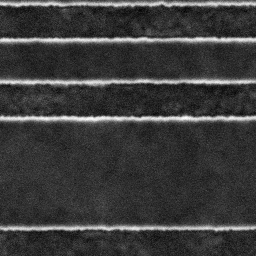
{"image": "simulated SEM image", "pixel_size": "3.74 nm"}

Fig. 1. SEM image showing lines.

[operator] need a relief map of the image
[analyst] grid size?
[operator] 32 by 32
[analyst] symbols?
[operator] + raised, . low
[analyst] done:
++++++++++++++++++++++++++++++++
................................
................................
................................
................................
++++++++++++++++++++++++++++++++
++++++++++++++++++++++++++++++++
++++++++++++++++++++++++++++++++
++++++++++++++++++++++++++++++++
++++++++++++++++++++++++++++++++
................................
................................
................................
................................
................................
++++++++++++++++++++++++++++++++
++++++++++++++++++++++++++++++++
++++++++++++++++++++++++++++++++
++++++++++++++++++++++++++++++++
++++++++++++++++++++++++++++++++
++++++++++++++++++++++++++++++++
++++++++++++++++++++++++++++++++
++++++++++++++++++++++++++++++++
++++++++++++++++++++++++++++++++
++++++++++++++++++++++++++++++++
++++++++++++++++++++++++++++++++
++++++++++++++++++++++++++++++++
++++++++++++++++++++++++++++++++
++++++++++++++++++++++++++++++++
................................
................................
................................